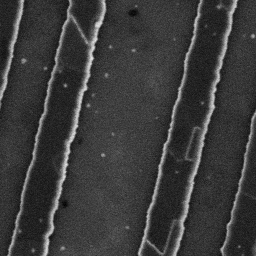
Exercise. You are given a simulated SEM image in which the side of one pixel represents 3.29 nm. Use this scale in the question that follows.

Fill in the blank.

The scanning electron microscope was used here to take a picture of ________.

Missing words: lines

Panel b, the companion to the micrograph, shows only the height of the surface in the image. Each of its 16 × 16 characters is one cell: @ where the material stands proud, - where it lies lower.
@---@@@-----@@@-
@---@@------@@--
@---@@------@@--
@---@@------@@--
@--@@@-----@@@--
---@@------@@---
---@@------@@---
---@@------@@---
--@@@-----@@@---
--@@------@@@--@
--@@------@@---@
--@@------@@---@
-@@@-----@@@---@
-@@------@@@--@@
-@@------@@---@@
-@@------@@---@@